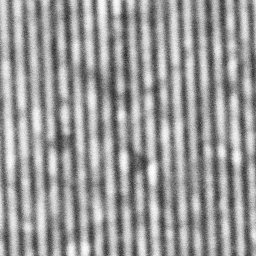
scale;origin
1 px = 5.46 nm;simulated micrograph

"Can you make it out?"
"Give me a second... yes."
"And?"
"parallel lines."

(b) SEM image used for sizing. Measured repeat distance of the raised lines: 77.1 nanometers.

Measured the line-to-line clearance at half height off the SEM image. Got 8.86 pixels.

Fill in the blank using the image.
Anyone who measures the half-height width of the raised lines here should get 29.3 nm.